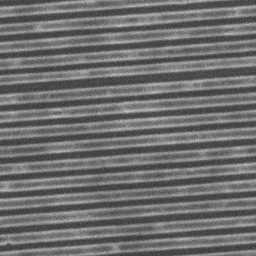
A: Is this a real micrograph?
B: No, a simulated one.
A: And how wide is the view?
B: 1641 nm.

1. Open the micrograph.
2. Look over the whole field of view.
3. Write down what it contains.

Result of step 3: parallel lines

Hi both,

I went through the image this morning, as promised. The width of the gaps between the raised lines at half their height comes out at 0.0487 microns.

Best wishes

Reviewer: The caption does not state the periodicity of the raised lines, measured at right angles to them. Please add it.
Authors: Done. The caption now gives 112 nm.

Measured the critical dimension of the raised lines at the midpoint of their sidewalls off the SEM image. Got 61.5 nanometres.